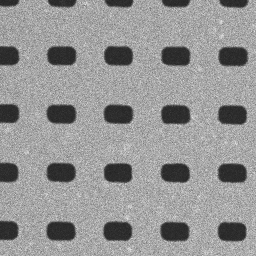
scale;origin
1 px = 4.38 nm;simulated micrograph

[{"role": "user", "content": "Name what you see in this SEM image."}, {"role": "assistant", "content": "a regular array of holes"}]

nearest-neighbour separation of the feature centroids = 250 nanometres